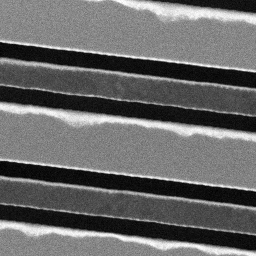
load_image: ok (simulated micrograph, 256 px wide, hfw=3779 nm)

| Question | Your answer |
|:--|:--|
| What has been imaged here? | lines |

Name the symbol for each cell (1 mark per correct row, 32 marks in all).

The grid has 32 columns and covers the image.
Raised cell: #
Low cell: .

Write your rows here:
####################............
#############################...
################################
################################
################################
..##############################
...........#####################
##.................#############
###########................#####
###################.............
###########################.....
......##########################
..............##################
#####..................#########
##############..................
######################..........
###############################.
################################
################################
################################
....############################
............####################
#####................###########
#############................###
#####################...........
#############################...
........########################
.................###############
#######..................#######
################................
#########################.......
################################